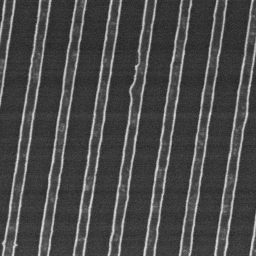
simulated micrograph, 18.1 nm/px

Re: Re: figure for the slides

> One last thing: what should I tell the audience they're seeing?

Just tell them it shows parallel lines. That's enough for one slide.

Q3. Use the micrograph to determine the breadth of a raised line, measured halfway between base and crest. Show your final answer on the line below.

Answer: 185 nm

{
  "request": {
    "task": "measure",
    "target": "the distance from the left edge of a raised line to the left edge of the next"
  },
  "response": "0.631 um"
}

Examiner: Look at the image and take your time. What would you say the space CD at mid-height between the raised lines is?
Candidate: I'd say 451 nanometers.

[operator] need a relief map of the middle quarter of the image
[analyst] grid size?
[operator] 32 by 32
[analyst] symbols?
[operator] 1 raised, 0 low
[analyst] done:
11100000011100000011100000011000
11100000011100000011000000011000
11100000011100000011000000011000
11000000011000000011000000011000
11000000011000000011000000111000
11000000011000000111000000111000
11000000011000000111000000111000
11000000111000000110000000110000
11000000111000000110000000110000
11000000111000000110000000110000
10000000110000000110000000110000
10000000110000001110000001110000
10000000110000001110000001110000
10000000110000001110000001110000
10000000110000001110000001100000
10000001110000001100000001100000
10000001100000001100000001100000
00000001100000001100000001100000
00000001100000011100000011100000
00000001100000011100000011100000
00000011100000011100000011100000
00000001100000011100000011000000
00000011100000011000000011000000
00000011000000011000000011000000
00000011000000011000000111000000
00000011000000111000000111000000
00000011000000111000000111000000
00000111000000111000000110000000
00000111000000110000000110000000
00000111000000110000000110000000
00000110000000110000001110000000
00000110000000110000001110000001